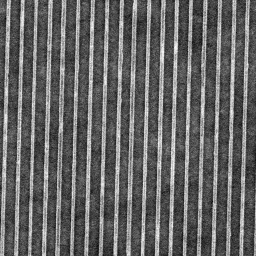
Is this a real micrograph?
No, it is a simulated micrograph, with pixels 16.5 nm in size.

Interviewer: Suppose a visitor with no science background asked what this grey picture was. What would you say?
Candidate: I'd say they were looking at parallel lines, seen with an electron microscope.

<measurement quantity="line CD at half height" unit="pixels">3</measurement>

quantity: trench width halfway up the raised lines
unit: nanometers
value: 189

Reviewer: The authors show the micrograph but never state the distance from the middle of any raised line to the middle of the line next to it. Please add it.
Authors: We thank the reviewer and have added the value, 232 nanometers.